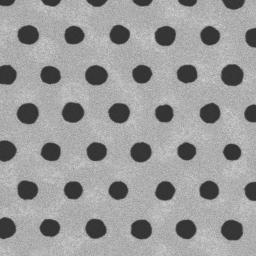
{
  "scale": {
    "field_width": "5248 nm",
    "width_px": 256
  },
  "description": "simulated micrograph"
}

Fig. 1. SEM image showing a regular array of holes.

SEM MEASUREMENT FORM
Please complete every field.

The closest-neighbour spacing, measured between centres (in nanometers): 904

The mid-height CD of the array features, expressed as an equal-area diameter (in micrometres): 0.405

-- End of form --